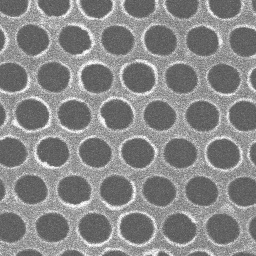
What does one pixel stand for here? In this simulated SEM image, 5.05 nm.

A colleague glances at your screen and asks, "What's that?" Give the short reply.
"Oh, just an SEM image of a regular array of holes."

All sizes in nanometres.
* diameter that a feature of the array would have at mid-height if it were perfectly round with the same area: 155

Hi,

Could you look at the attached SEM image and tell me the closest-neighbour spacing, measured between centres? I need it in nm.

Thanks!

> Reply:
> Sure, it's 214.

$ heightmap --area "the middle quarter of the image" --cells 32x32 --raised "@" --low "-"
@@@@@@----@@@@@@-----@@@@@@----@
-@@@@------@@@@-------@@@@------
-@@@--------@@@-------@@@-------
-@@@--------@@@--------@@-------
-@@@@-------@@@--------@@@------
-@@@@-------@@@@------@@@@------
@@@@@@-----@@@@@@-----@@@@@-----
@@@@@@@@@@@@@@@@@@@@@@@@@@@@@@@@
@@@@@@@@@@@@@@@@@@@@@@@@@@@@@@@@
----@@@@@@@----@@@@@@@---@@@@@@@
------@@@@------@@@@@-----@@@@@-
------@@@--------@@@-------@@@@-
-------@@--------@@@--------@@--
-------@@@-------@@@--------@@--
------@@@@-------@@@--------@@@-
------@@@@@-----@@@@@------@@@@@
@@-@@@@@@@@@@@@@@@@@@@@--@@@@@@@
@@@@@@@@@@@@@@@@@@@@@@@@@@@@@@@@
@@@@@@@--@@@@@@@@@-@@@@@@@@@@@@@
@@@@@-----@@@@@@-----@@@@@------
-@@@-------@@@@-------@@@-------
-@@@--------@@--------@@@-------
-@@@--------@@@--------@@-------
-@@@--------@@@-------@@@-------
@@@@@------@@@@-------@@@@------
@@@@@@----@@@@@@-----@@@@@@----@
@@@@@@@@@@@@@@@@@@@@@@@@@@@@@@@@
@@@@@@@@@@@@@@@@@@@@@@@@@@@@@@@@
-----@@@@@@----@@@@@@----@@@@@@@
------@@@@------@@@@-------@@@@-
------@@@--------@@@-------@@@@-
-------@@--------@@@--------@@--